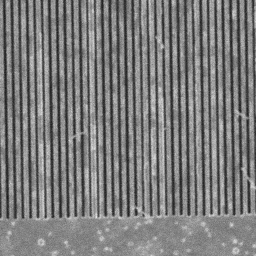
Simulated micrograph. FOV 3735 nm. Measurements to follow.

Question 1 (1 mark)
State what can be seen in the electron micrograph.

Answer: parallel lines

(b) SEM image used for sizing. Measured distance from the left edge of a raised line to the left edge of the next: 110 nanometres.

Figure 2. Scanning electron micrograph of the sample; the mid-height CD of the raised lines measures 0.062 µm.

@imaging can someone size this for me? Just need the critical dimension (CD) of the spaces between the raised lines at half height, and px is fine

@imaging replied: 3.37